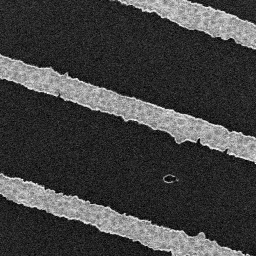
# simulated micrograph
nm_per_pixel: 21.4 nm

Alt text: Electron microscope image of one or a few lines or trenches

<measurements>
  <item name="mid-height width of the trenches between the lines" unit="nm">1930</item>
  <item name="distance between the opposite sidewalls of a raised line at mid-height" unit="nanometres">447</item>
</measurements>